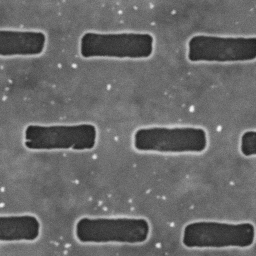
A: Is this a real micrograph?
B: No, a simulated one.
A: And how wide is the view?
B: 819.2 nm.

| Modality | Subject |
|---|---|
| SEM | holes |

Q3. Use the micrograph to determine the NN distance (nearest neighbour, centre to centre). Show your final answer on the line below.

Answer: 0.34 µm